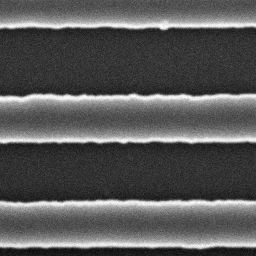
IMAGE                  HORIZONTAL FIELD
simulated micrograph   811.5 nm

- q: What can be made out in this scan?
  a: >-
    lines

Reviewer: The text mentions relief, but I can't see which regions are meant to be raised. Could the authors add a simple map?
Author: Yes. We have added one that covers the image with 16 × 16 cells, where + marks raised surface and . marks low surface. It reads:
++++++++++++++++
++++++++++++++++
................
................
................
................
++++++++++++++++
++++++++++++++++
++++++++++++++++
................
................
................
................
++++++++++++++++
++++++++++++++++
................